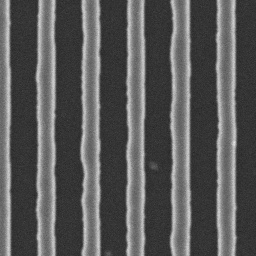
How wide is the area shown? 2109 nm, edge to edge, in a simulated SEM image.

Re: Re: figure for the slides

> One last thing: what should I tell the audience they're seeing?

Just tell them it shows lines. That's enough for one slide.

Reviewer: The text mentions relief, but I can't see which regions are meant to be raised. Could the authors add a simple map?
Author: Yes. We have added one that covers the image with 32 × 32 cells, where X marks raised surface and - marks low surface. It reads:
X----XX---XX----XX---XXX---XX---
X----XX---XX----XX----XX---XX---
X----XX---XX----XX----XX---XX---
X----XX---XX----XX----XX---XX---
X----XX----X----XX----XX---XX---
X----XX---XX----XX---XXX---XX---
X----XX---XX----XX---XXX---XX---
X----XX---XX----XX---XXX---XX---
X----XX---XX----XX---XXX---XX---
X----XX---XX----XX----XX---XX---
X----XX---XX----XX----XX---XX---
X----XX---XX----XX----XX---XX---
X----XX---XX----XX----XX---XX---
X----XX---XX----XX---XXX---XX---
X----XX---XX----XX---XXX---XX---
X----XX---XX----XX---XXX---XX---
X----XX---XX----XX---XXX---XX---
X----XX---XX----XX---XXX---XX---
X----XX---XX----XX----XX---XX---
X----XX---XX----XX----XX---XX---
X----XX---XX----XX----XX---XX---
X----XX----X----XX---XXX---XX---
X----XX----X----XX---XXX---XX---
X----XX----X----XX----XX---XX---
X----XX---XX----XX---XXX---XX---
X----XX---XX----XX----XX---XX---
X----XX---XX----XX----XX---XX---
X----XX---XX----XX----XX---XX---
X----XX----X----XX----XX---XX---
X----XX----X----XX---XXX---XX---
X----XX----X----XX---XXX---XX---
X----XX---XX----XX---XXX---XX---